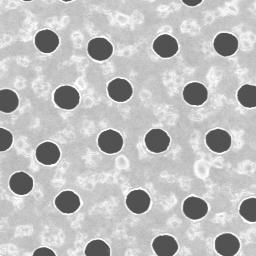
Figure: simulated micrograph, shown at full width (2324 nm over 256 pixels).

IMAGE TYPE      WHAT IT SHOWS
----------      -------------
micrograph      a regular array of holes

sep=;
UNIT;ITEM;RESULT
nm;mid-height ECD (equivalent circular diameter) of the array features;219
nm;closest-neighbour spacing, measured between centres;474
